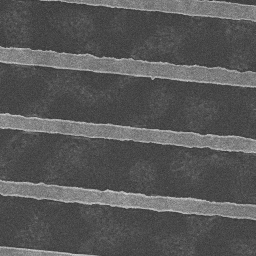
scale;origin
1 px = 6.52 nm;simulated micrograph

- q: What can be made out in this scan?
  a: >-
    one or a few lines or trenches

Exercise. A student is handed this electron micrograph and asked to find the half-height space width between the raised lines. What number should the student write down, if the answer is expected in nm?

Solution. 340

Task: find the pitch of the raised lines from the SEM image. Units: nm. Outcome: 431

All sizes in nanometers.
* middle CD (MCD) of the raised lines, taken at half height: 92.4